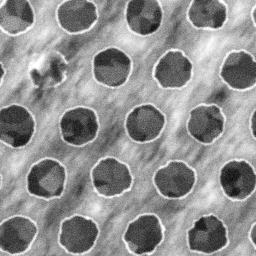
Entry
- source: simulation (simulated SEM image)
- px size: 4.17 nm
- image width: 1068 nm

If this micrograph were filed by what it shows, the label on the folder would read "a regular array of raised bodies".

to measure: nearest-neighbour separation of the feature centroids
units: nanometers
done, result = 256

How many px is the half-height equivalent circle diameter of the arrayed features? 40.3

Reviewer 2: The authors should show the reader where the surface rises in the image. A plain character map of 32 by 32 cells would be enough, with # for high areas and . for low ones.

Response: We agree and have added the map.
####....####....####....####....
####...#####....####...#####....
####...#####....####....####....
####....###.....####.....###....
................................
................................
............###......##......##.
............####....####....####
............####...#####....####
............####...#####....####
.............##.....###.....####
................................
................................
###......##......###....###.....
####....####....#####...####...#
####...#####....#####..#####...#
####....####....####....####...#
####....####.....##......##.....
................................
................................
....####....####.....##.....###.
....####...#####....####...#####
...#####....#####..#####...#####
...#####....####....####....####
....###......#......###.....###.
................................
................................
.###....###......###.....###....
#####...####....####....####...#
####...#####...#####...#####...#
####....####....####....####....
.##......##.....###......##.....